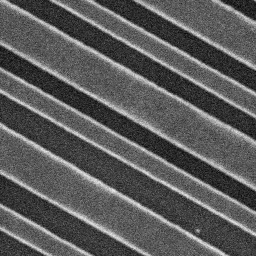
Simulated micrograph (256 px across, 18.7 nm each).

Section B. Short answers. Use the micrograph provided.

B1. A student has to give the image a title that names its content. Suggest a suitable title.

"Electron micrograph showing lines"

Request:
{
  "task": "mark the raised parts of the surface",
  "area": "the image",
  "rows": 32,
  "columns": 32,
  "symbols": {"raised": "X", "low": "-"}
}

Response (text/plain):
X------XXXXX------XXXXXXXXXX----
XXX------XXXXX-----XXXXXXXXXXX--
XXXXX------XXXXX-----XXXXXXXXXX-
XXXXXXX-----XXXXXX-----XXXXXXXXX
XXXXXXXXX-----XXXXX------XXXXXXX
XXXXXXXXXX------XXXXX-----XXXXXX
--XXXXXXXXXX------XXXXX-----XXXX
---XXXXXXXXXXX-----XXXXXX-----XX
-----XXXXXXXXXXX-----XXXXX------
XX-----XXXXXXXXXX------XXXXX----
XXXX-----XXXXXXXXXX------XXXXX--
XXXXX-----XXXXXXXXXXX-----XXXXXX
--XXXXX-----XXXXXXXXXXX-----XXXX
----XXXXX-----XXXXXXXXXXX-----XX
-----XXXXXX-----XXXXXXXXXX-----X
-------XXXXXX-----XXXXXXXXXX----
XX-------XXXXX-----XXXXXXXXXXX--
XXXX-------XXXXX-----XXXXXXXXXXX
XXXXX-------XXXXXX-----XXXXXXXXX
XXXXXXX-------XXXXXX----XXXXXXXX
XXXXXXXXX-------XXXXX-----XXXXXX
XXXXXXXXXX--------XXXXX-----XXXX
-XXXXXXXXXXX--------XXXXX-----XX
---XXXXXXXXXXX-------XXXXXX----X
-----XXXXXXXXXXX-------XXXXX----
-------XXXXXXXXXX--------XXXXX--
XX-------XXXXXXXXXX--------XXXXX
XXX-------XXXXXXXXXXX-------XXXX
XXXXX-------XXXXXXXXXXX-------XX
--XXXXX-------XXXXXXXXXX--------
---XXXXXX-------XXXXXXXXXX------
-----XXXXXX------XXXXXXXXXXX----